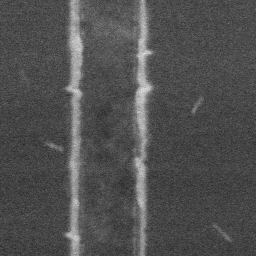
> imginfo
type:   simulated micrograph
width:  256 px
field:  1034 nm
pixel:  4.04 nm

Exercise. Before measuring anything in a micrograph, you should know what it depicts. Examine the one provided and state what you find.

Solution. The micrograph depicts one or a few lines or trenches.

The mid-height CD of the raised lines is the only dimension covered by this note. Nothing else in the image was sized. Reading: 0.283 um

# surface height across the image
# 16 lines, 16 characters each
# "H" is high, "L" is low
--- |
LLLLLHHHHLLLLLLL
LLLLLHHHHLLLLLLL
LLLLLHHHHLLLLLLL
LLLLLHHHHLLLLLLL
LLLLLHHHHLLLLLLL
LLLLLHHHHLLLLLLL
LLLLLHHHHLLLLLLL
LLLLLHHHHLLLLLLL
LLLLLHHHHLLLLLLL
LLLLLHHHHLLLLLLL
LLLLLHHHHLLLLLLL
LLLLLHHHHLLLLLLL
LLLLLHHHHLLLLLLL
LLLLLHHHHLLLLLLL
LLLLHHHHHLLLLLLL
LLLLLHHHHLLLLLLL